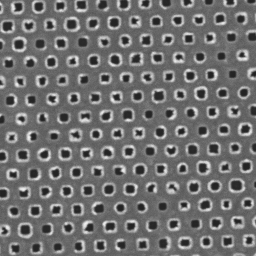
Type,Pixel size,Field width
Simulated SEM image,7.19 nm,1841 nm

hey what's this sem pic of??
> a regular array of holes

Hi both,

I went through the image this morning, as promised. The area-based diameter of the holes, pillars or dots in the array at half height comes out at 58.5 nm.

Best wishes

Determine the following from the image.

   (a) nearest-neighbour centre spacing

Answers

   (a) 150 nm